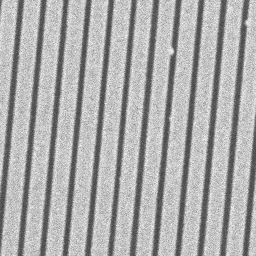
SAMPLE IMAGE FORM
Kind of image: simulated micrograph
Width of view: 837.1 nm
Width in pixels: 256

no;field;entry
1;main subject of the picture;parallel lines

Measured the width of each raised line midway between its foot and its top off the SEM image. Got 55.3 nm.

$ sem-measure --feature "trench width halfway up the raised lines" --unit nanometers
20.3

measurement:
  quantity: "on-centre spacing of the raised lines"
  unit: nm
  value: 73.3